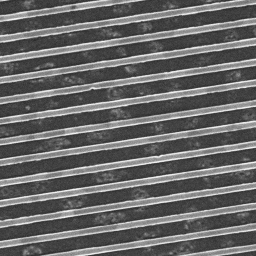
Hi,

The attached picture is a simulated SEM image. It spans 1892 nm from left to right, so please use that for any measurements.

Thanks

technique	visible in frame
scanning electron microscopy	parallel lines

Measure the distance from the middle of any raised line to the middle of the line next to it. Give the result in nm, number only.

150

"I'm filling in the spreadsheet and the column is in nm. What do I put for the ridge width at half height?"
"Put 46.6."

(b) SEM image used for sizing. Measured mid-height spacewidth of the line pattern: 0.107 micrometres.